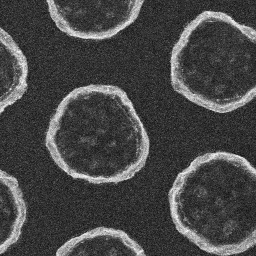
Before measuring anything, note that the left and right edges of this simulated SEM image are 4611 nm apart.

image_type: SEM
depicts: raised bodies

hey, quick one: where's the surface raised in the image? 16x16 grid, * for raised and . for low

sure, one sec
...*****........
....****....***.
...........*****
*..........*****
*..........*****
*..........*****
....****.....**.
....*****.......
...******.......
...******.......
....****....****
*..........*****
*..........*****
*..........*****
*.....*.....****
....****.....**.